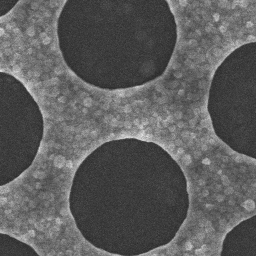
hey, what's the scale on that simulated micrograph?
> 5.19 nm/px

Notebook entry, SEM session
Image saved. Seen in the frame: holes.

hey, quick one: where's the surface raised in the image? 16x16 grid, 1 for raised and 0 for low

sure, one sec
0111000000011111
1111000000011111
1111000000011111
1111000000011100
1111100000111000
0011110011111000
0011111111111000
0001111111111000
0001111111111100
0011110000111110
0011100000011111
1111100000001111
1111000000001111
1111100000001111
1111100000011100
0011110000111100